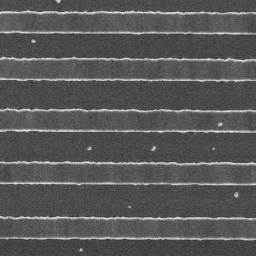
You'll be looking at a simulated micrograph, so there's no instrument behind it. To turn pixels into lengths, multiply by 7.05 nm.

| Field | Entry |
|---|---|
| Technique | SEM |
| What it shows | lines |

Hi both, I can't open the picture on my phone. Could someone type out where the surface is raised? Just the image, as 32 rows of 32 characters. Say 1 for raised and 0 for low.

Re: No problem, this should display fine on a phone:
00000000000000000000000000000000
11111111111011111111000001000000
11111111111111111111111111111111
11111111111111111111111111111111
00000000000000000000000000000000
00000000000000000000000000000000
00000000000000000000000000000000
11111111111111111111111111111101
11111111111111111111111111111111
11111111111111111111111111111111
00000000000000000000000000000000
00000000000000000000000000000000
00000000000000000000000000000000
00000000000000000000000000000000
11111111111111111111111111111111
11111111111111111111111111111111
00000000000000000000000000000000
00000000000000000000000000000000
00000000000000000000000000000000
00000000000000000000000000000000
11111111111111111111111111111111
11111111111111111111111111111111
11111111111111111111111111111111
00000000000000000000000000000000
00000000000000000000000000000000
00000000000000000000000000000000
00000000000000000000000000000000
11111111111111111111111111111111
11111111111111111111111111111111
11111111111111111111111111111111
00000000000000000000000000000000
00000000000000000000000000000000